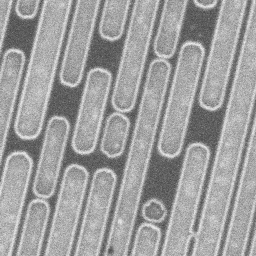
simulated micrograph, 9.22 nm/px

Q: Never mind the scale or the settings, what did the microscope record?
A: parallel lines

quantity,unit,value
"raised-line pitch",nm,263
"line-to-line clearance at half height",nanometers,178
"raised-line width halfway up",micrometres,0.0886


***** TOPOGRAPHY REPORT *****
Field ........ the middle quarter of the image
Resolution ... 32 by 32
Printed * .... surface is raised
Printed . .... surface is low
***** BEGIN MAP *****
.....*********......**....***...
....****.*****.....***....**....
....***....***.....**.....**....
....**.....***.....**.....**....
...***.....***.....**.....**....
******.....**.....***....**.....
******.....**.....**.....**.....
*****......**.....**.....**.....
*****.....**......**.....**.....
*****.....**.....***....**......
*****.....***....***....**......
****......****..***.....**.....*
****.....**********.....**.....*
****.....**....****....***.....*
.***.....**.....***....**......*
.**......**.....**.....**.....**
.**.....***.....**.....**.....**
.**.....**.....***....***.....**
***.....**.....***....**......**
**......**.....**.....**.....***
***.....**.....**.....**.....***
***....***....***....***.....**.
***********...***....****...***.
****************.....**********.
****************.....*********..
**.*************....**********..
*....***********....**********..
......**....***.....**********..
......**.....**.....*********...
.....***.....**.....*********...
.....**.....***....**********...
.....**.....***....**********...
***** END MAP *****